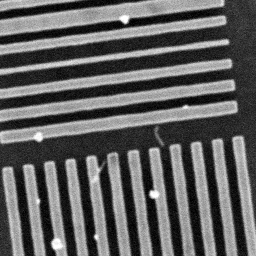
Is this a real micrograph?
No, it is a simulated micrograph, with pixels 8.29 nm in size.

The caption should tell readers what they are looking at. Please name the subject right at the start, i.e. groups of lines, slits or small figures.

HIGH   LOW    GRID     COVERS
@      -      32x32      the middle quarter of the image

----------------------------@@@@
----------------------@@@@@@@@@@
-------------@@@@@@@@@@@@@@@@@--
-----@@@@@@@@@@@@@@@@@----------
@@@@@@@@@@@@@@@-----------------
@@@@@@@------------------------@
------------------------@@@@@@@@
---------------@@@@@@@@@@@@@@@@@
---------@@@@@@@@@@@@@@@@@@@----
@@@@@@@@@@@@@@@@@@@-------------
@@@@@@@@@@@@--------------------
@@@@@---------------------@@@@@@
------------------@@@@@@@@@@@@@@
-----------@@@@@@@@@@@@@@@@@@@@@
--@@@@@@@@@@@@@@@@@@@@@@@-------
@@@@@@@@@@@@@@@@@@--------------
@@@@@@@@@@----------------------
@-------------------------------
--------------------------------
--------------------------------
---------------------------@@---
---------------------@@@---@@---
------------@---@@@--@@@---@@---
------@@---@@---@@@---@@---@@---
-@@---@@---@@@--@@@---@@---@@---
-@@---@@---@@@--@@@---@@---@@@--
-@@---@@@--@@@---@@---@@---@@@--
-@@---@@@--@@@---@@---@@---@@@--
-@@---@@@---@@---@@---@@@---@@--
-@@----@@---@@---@@---@@@---@@--
-@@@---@@---@@---@@@---@@---@@--
-@@@---@@---@@---@@@--@@@---@@--